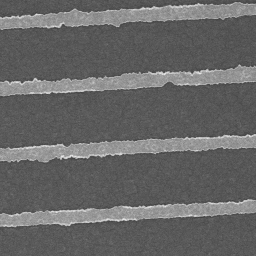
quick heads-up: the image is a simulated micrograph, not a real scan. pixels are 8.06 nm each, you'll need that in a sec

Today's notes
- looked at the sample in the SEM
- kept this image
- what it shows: one or a few lines or trenches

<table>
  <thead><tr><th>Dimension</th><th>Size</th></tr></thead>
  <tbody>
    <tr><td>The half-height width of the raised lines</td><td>13.1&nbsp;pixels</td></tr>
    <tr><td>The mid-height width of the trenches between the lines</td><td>421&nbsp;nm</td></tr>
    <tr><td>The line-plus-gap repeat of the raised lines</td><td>530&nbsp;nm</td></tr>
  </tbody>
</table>